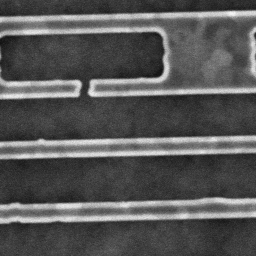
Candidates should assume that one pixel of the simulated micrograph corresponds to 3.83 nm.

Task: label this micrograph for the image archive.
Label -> one or a few lines or trenches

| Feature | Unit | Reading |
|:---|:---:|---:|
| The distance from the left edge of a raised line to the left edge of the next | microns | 0.24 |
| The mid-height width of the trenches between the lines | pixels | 49.5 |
